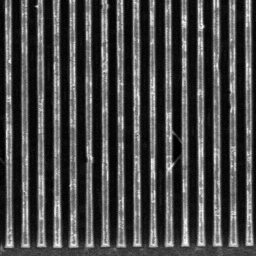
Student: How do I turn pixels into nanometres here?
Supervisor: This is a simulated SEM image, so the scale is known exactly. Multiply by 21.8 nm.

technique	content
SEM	parallel lines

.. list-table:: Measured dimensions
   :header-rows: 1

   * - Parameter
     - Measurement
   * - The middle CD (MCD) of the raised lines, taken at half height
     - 147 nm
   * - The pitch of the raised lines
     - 348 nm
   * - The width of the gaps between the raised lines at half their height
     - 207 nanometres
